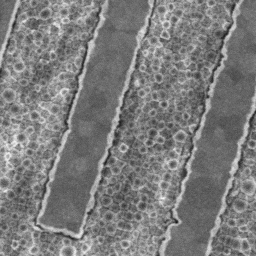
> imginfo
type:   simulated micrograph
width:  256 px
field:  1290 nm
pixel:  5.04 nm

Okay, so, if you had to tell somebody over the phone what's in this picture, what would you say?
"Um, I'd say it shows one or a few lines or trenches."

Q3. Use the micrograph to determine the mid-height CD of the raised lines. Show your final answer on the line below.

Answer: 0.226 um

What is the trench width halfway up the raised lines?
0.416 um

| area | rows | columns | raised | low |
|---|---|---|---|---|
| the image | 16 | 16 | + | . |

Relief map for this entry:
+.....+++......+
+.....+++......+
......+++.....++
.....+++......++
.....+++......++
.....+++.....+++
.....+++.....+++
....+++......+++
....+++.....+++.
....+++.....+++.
...+++......+++.
...+++.....+++..
...+++.....+++..
..+++......+++..
....+.....+++...
..........+++...